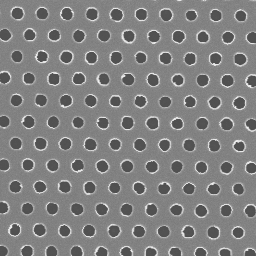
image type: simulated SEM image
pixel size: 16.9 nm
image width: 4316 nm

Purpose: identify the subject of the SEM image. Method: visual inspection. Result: a regular array of holes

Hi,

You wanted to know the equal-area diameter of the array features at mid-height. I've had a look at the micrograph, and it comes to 190 nanometers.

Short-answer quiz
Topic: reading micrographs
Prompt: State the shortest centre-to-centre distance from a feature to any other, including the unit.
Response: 411 nm